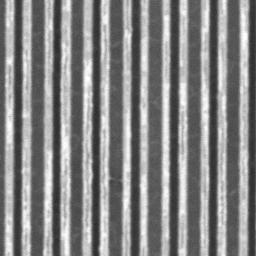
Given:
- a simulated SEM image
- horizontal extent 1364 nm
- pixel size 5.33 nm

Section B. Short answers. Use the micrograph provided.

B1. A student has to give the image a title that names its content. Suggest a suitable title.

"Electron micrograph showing parallel lines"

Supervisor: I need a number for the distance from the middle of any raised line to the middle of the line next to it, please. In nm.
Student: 104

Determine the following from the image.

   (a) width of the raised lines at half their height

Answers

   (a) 44 nanometres